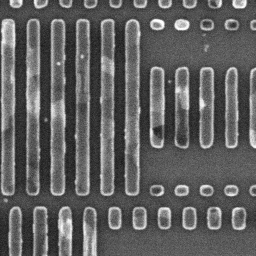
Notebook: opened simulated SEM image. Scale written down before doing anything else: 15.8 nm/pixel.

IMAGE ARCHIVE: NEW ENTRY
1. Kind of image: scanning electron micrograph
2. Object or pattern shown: wiring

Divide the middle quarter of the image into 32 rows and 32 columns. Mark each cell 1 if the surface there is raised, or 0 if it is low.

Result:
00011100011100011110000000000000
00011100011100011110001110001110
00011100011100011110001110001110
00011100011100011110001110001110
00011100011100011110001110001110
00011100011100011110001110001110
00011100011100011110001110001110
00011100011100011100001110001110
00011100011100011110001110001110
00011100011100011110001110001110
00011100011100011110001110001110
00011100011100011110001110001110
00011100011100011110001110001110
00011100011100011110001110001110
00011100011100011100001110001110
00011100011100011100001110001110
00011100011100011110001110001110
00011100011100011110001110001110
00011100011100011110001110001110
00011100011100011110001110001110
00011100011100011110001100001110
00011100011100011100000000000000
00011100011100011100000000000000
00011100011100011100000000000000
00011100011100011100000000000000
00011100011100011100000000000000
00011100011100011110000000000000
00011100011100011110000000000000
00011100011100011110000000000000
00011100011100011110000000000000
00011100011100011100000000000000
00011100011100011100001110001110